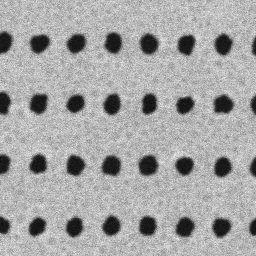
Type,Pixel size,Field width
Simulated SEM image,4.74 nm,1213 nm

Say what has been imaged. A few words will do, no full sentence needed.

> a regular array of holes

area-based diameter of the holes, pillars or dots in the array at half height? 86.8 nm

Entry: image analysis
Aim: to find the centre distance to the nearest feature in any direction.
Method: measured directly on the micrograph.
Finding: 0.173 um